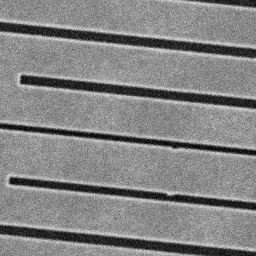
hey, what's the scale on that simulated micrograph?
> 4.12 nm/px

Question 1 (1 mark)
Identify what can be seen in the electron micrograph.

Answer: parallel lines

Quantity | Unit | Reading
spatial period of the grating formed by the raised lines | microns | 0.208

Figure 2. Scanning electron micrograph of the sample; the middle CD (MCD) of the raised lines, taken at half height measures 161 nm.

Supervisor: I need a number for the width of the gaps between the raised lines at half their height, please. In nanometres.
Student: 43.1